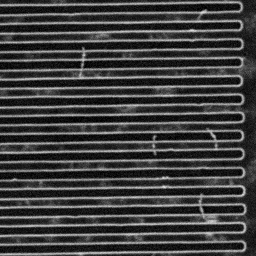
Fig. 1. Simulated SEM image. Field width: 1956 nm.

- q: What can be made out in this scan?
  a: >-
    parallel lines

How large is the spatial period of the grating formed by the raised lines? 141 nm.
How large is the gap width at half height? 69.7 nm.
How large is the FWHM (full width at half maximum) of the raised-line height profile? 70.7 nm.